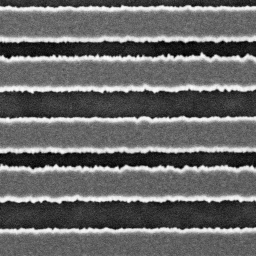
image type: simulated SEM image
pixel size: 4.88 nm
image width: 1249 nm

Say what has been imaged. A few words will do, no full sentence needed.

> lines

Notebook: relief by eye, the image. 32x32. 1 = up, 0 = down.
00000000000000000000000000000000
11111111111111111111111111111111
11111111111111111111111111111111
11111111111111111111111111111111
11111111111111111111111111111111
00000000000000000000000000000000
00000000000000000000000000000000
11111111111111111111111111111111
11111111111111111111111111111111
11111111111111111111111111111111
11111111111111111111111111111111
00000000000000000000000000000000
00000000000000000000000000000000
00000000000000000000000000000000
00000000000000000000000000000000
11111111111111111111111111111111
11111111111111111111111111111111
11111111111111111111111111111111
11111111111111111111111111111111
00000000000000000000000000000000
00000000000000000000000000000000
11111111111111111111111111111111
11111111111111111111111111111111
11111111111111111111111111111111
11111111111111111111111111111111
00000000000000000000000000000000
00000000000000000000000000000000
00000000000000000000000000000000
00000000000000000000000000000000
11111111111111111111111111111111
11111111111111111111111111111111
11111111111111111111111111111111